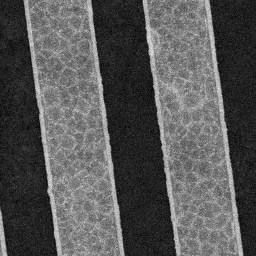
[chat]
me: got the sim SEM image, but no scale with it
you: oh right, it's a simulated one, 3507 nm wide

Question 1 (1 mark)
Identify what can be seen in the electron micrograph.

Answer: one or a few lines or trenches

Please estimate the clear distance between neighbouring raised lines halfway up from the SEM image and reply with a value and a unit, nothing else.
755 nanometres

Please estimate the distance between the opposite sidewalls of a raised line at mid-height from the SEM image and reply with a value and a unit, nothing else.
0.851 micrometres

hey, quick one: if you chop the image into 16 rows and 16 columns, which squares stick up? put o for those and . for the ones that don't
..oooo...oooo...
..oooo...oooo...
..oooo...oooo...
..oooo....ooo...
..oooo....ooo...
..oooo....oooo..
...ooo....oooo..
...oooo...oooo..
...oooo...oooo..
...oooo...oooo..
...oooo...oooo..
...oooo....ooo..
...oooo....oooo.
...oooo....oooo.
....ooo....oooo.
....oooo...oooo.